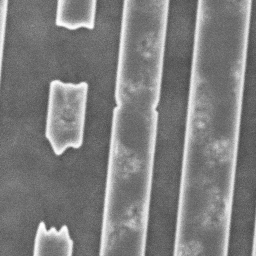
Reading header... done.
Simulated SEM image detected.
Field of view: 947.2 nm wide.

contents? one or a few lines or trenches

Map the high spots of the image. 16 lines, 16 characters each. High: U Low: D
DDDDUUDDUUDDUUUU
DDDDUUDDUUDDUUUU
DDDDDDDDUUDDUUUD
DDDDDDDUUUDDUUUD
DDDDDDDUUUDDUUUD
DDDUUDDUUUDDUUUD
DDDUUDDUUUDDUUUD
DDDUUDDUUUDDUUUD
DDDUUDDUUUDDUUUD
DDDDDDDUUUDDUUUD
DDDDDDDUUDDUUUUD
DDDDDDDUUDDUUUUD
DDDDDDDUUDDUUUDD
DDDDDDDUUDDUUUDD
DDUUDDUUUDDUUUDD
DDUUDDUUUDDUUUDD